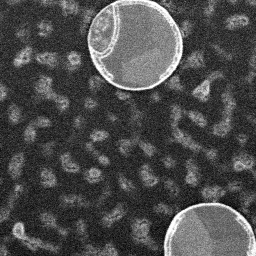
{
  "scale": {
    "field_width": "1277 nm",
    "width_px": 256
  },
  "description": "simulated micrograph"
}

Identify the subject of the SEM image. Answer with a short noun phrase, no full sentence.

raised bodies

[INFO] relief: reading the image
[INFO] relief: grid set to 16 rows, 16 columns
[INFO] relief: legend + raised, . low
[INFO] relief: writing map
.......+++......
.......++++.....
.......++++.....
......+++++.....
......+++++.....
........+.......
................
................
................
................
................
................
................
...........++++.
...........+++++
..........++++++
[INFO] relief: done